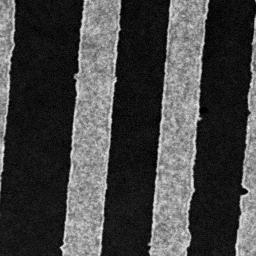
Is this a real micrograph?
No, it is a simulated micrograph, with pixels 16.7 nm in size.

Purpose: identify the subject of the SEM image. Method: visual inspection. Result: one or a few lines or trenches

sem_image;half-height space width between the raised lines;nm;848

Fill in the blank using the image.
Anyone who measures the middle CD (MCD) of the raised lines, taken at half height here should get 35.5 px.